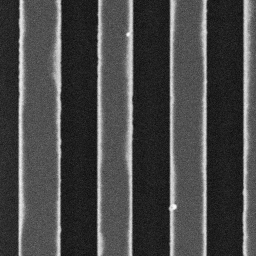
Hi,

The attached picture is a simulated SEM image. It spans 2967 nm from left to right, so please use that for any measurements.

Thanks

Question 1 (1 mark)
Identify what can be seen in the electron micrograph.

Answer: lines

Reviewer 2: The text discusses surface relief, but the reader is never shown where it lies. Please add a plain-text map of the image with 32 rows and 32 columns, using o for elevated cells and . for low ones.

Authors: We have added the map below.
...ooooo....ooooo....ooooo.....o
...ooooo....ooooo....ooooo.....o
...ooooo....ooooo....ooooo.....o
...ooooo....ooooo....ooooo.....o
...ooooo....ooooo....ooooo.....o
..oooooo....ooooo....ooooo.....o
..oooooo....oooo.....ooooo.....o
...oooo.....ooooo....ooooo.....o
..ooooo.....oooo.....ooooo.....o
..oooooo....ooooo....ooooo.....o
..oooooo....ooooo....ooooo.....o
..oooooo....oooo.....ooooo.....o
..oooooo....oooo.....ooooo.....o
..oooooo....oooo.....ooooo.....o
..ooooo.....oooo.....ooooo.....o
..ooooo.....oooo.....ooooo.....o
..ooooo.....oooo.....ooooo.....o
..oooooo....oooo.....ooooo.....o
..ooooo.....oooo.....ooooo.....o
..oooooo....oooo.....ooooo.....o
..ooooo.....oooo.....ooooo.....o
..ooooo.....oooo.....ooooo.....o
..ooooo.....oooo.....ooooo.....o
..ooooo.....oooo.....ooooo.....o
..ooooo.....oooo.....ooooo.....o
..ooooo.....oooo.....ooooo.....o
..ooooo.....oooo.....ooooo....oo
..ooooo.....oooo.....ooooo....oo
..oooooo....oooo.....ooooo.....o
..ooooo.....oooo.....ooooo.....o
..ooooo.....oooo.....ooooo....oo
..ooooo.....oooo.....ooooo....oo